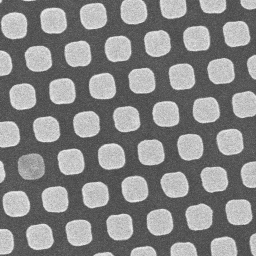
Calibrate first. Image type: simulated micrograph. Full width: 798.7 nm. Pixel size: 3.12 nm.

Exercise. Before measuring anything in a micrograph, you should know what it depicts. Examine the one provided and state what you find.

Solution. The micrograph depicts a regular array of raised bodies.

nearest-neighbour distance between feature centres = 124 nanometers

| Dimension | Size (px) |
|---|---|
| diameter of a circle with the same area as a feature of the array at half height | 26.9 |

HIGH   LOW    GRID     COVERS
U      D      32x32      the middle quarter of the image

DDUDDDDDDDDDDDDDDDDDDDDDDDDUUUUU
DDDDDDDDDDDDDDDDDUUUUDDDDDUUUUUU
DDDDDDDDDUUDDDDDUUUUUUDDDDUUUUUU
DDDDDDDUUUUUDDDDUUUUUUDDDDUUUUUU
UUDDDDUUUUUUUDDDUUUUUUUDDDDUUUUU
UUDDDDUUUUUUUDDDDUUUUUUDDDDUUUUU
UUDDDDDUUUUUUDDDDUUUUUDDDDDDDDDD
UUUDDDDUUUUUUDDDDDDDDDDDDDDDDDDD
UUUDDDDDUUUUDDDDDDDDDDDDDDDDDDDD
UUDDDDDDDDDDDDDDDDDDDDDDUUUDDDDD
DDDDDDDDDDDDDDDDDDDDDDDUUUUUDDDD
DDDDDDDDDDDDDUUUUUDDDDUUUUUUUDDD
DDDUUUUUDDDDUUUUUUUDDDUUUUUUUDDD
DDDUUUUUUDDDDUUUUUUDDDUUUUUUUDDD
DDUUUUUUUDDDDUUUUUUDDDDUUUUUUDDD
DDDUUUUUUDDDDUUUUUUDDDDDDUDDDDDD
DDDUUUUUUDDDDDUUUUDDDDDDDDDDDDDD
DDDUUUUUDDDDDDDDDDDDDDDDDDDDDDDD
DDDDDDDDDDDDDDDDDDDDDDDDDDDDDUUU
DDDDDDDDDDDDDDDDDDDUUUUUDDDDUUUU
DDDDDDDDDDUUUUDDDDDUUUUUUDDDDUUU
UUUDDDDDDUUUUUUDDDDUUUUUUDDDDUUU
UUUUDDDDDUUUUUUDDDDUUUUUUDDDDUUU
UUUUUDDDDUUUUUUDDDDUUUUUUDDDDDUU
UUUUUDDDDUUUUUUDDDDUUUUUDDDDDDDD
UUUUUDDDDUUUUUUDDDDDDDDDDDDDDDDD
UUUUUDDDDDDDDDDDDDDDDDDDDDDDDDDD
UDDDDDDDDDDDDDDDDDDDDDDDDUUUUUDD
DDDDDDDDDDDDDDDDUUUUDDDDUUUUUUDD
DDDDDDDDDDDDDDDUUUUUUDDDUUUUUUUD
DDDDDUUUUUDDDDUUUUUUUDDDUUUUUUUD
DDDDDUUUUUUDDDDUUUUUUDDDDUUUUUUD